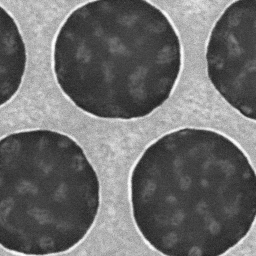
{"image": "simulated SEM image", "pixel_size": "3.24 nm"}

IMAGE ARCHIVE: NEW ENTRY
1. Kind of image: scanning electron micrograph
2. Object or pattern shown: holes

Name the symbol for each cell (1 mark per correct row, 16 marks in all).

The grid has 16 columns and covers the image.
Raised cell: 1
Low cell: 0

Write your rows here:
1111100000111100
0111000000011000
0110000000011000
0010000000011000
0010000000011000
0111000000011000
1111100000111100
1111111111111111
0000111111000011
0000011110000001
0000001100000000
0000001100000000
0000001100000000
0000001100000000
0000001110000000
0000011111000011